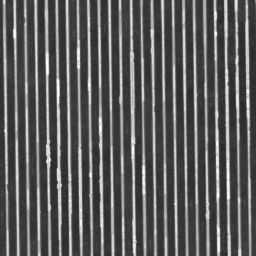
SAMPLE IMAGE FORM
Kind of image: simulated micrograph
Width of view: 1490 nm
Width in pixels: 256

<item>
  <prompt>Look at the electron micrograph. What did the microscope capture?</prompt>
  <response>parallel lines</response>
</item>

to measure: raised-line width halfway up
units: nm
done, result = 16.7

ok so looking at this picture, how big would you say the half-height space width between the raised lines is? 44.4 nanometers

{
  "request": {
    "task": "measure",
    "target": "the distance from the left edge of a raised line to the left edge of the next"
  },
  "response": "0.0614 micrometres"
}